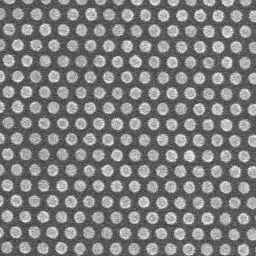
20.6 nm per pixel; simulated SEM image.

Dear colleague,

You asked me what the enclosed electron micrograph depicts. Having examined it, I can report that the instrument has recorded a regular array of raised bodies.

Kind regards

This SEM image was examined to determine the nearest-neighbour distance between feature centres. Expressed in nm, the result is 364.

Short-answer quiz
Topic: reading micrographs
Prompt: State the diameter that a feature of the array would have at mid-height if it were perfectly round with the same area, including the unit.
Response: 228 nm